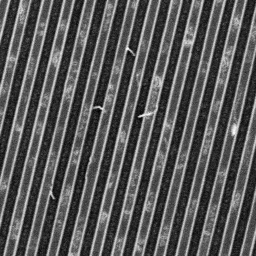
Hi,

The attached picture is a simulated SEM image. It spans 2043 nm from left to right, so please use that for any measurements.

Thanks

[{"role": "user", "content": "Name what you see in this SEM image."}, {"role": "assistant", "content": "parallel lines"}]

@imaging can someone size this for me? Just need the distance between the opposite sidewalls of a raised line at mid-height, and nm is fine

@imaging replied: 80.6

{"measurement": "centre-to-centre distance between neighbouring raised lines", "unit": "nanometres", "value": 167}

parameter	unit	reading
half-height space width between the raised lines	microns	0.0884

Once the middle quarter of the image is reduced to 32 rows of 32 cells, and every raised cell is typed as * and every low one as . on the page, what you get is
.***...**...***...**...***...**.
.***...**...**...***...**...***.
.**...***...**...***...**...**..
.**...***...**...***..***...**..
.**...**...***...**...***..***..
***...**...***...**...**...***..
***..***...**...***..***...**...
**...***...**...***..***...**...
**...***..***...**...***..***...
**...**...***...**...***..***...
**...**...**...***...**...**...*
*...***..***...***...**...**...*
*...***..***...**...***...**...*
*...**...***...**...***..***...*
*...**...***..***...**...***...*
....**...**...***...**...**...**
...***...**...**...***...**...**
...**...***...**...***...**...**
...**...***..***...**...***...**
..***...**...***...**...***..***
..***...**...***..***...**...***
..**...***...**...**....**...**.
..**...***...**...**...***...**.
.***...**...***...**...**...***.
.***..***...***..***...**...***.
.***..***...**...***..***...**..
.**...***...**...**...***...**..
.**...**...***...**...**...***..
***...**...***...**...**...***..
***..***...**...***..***...**...
**...***...**...***..***...**...
**...***..***...**...***..***...